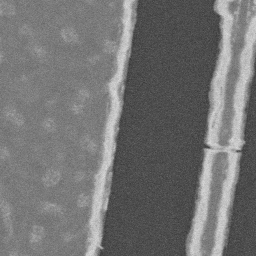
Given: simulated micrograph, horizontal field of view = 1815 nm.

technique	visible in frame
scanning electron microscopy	one or a few lines or trenches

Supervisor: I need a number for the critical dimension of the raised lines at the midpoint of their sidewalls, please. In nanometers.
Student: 163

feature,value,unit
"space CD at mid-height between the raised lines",0.716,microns